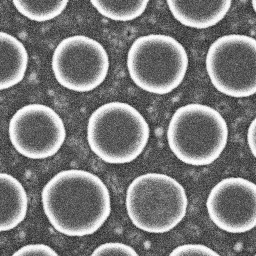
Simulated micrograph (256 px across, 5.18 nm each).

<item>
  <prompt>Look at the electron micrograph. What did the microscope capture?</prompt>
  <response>raised bodies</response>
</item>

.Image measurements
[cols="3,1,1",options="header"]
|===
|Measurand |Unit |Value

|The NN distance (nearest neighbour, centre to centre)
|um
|0.411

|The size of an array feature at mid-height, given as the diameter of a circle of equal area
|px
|56.9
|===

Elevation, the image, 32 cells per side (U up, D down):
DDUUUUUUDDDDUUUUUUDDDUUUUUUUUDDD
DDDUUUUDDDDDDUUUUUDDDDUUUUUUDDDD
DDDDDDDDDDDDDDDDDDDDDDDUUUUDDDDD
DDDDDDDDDDDDDDDDDDDDDDDDDDDDDDDD
UDDDDDDDDDDDDDDDDDDDDDDDDDDDDDDD
UUDDDDDDUUUUDDDDDUUUUUDDDDDUUUUU
UUUDDDDUUUUUUDDDUUUUUUUDDDUUUUUU
UUUDDDDUUUUUUDDDUUUUUUUDDDUUUUUU
UUUDDDDUUUUUUDDDUUUUUUUDDDUUUUUU
UUUDDDDUUUUUUDDDDUUUUUUDDDUUUUUU
UUDDDDDDUUUUDDDDDUUUUUDDDDDUUUUU
DDDDDDDDDDDDDDDDDDDDDDDDDDDDUUUU
DDDDDDDDDDDDDDDDDDDDDDDDDDDDDDDD
DDDUUUDDDDDDDUUUDDDDDDDUUUDDDDDD
DDUUUUUDDDDDUUUUUDDDDDUUUUUDDDDD
DDUUUUUUDDDUUUUUUUDDDUUUUUUUDDDD
DUUUUUUUDDDUUUUUUUDDDUUUUUUUDDDU
DDUUUUUUDDDUUUUUUUDDDUUUUUUUDDDU
DDUUUUUDDDDDUUUUUUDDDDUUUUUUDDDD
DDDDUUDDDDDDDUUUUDDDDDUUUUUDDDDD
DDDDDDDDDDDDDDDDDDDDDDDDDDDDDDDD
DDDDDDDDUUDDDDDDDDDDDDDDDDDDDDDD
UUDDDDDUUUUUDDDDDDDUUDDDDDDDDUDD
UUUDDDUUUUUUUDDDUDDDDDDDDDDUUUUU
UUUDDDUUUUUUUDDDUDDDDDDDDDUUUUUU
UUUDDDUUUUUUUUDDUDDDDDDDDDUUUUUU
UUUDDDUUUUUUUDDDUDDDDDDDDDUUUUUU
UUDDDDUUUUUUUDDDDDDUUUDDDDDUUUUU
UDDDDDDUUUUUDDDDDDDDDDDDDDDDUUUD
DDDDDDDDDDDDDDDDDDDDDDDDDDDDDDDD
DDDDDDDDDDDDDDDDDDDDDDDDDDDDDDDD
DDUUUUDDDDDDUUUUUDDDDDUUUUDDDDDD